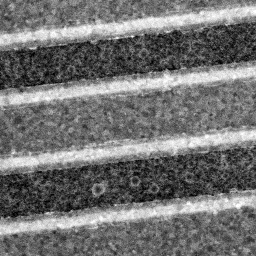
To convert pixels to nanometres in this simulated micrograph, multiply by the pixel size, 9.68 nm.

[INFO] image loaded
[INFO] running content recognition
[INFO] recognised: one or a few lines or trenches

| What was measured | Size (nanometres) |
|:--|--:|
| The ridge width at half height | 602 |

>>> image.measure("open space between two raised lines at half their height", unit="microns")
0.606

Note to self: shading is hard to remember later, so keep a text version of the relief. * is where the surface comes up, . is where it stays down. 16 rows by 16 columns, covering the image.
****************
*********.......
................
................
................
.......*********
****************
****************
***************.
*******.........
................
................
................
........********
****************
****************